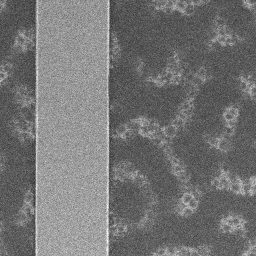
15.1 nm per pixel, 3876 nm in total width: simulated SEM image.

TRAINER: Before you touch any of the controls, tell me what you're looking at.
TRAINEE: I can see one or a few lines or trenches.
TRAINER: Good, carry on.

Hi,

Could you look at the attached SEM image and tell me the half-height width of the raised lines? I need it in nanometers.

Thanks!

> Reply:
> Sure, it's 1080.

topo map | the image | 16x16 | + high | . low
..+++++.........
..+++++.........
..+++++.........
..+++++.........
..+++++.........
..+++++.........
..+++++.........
..+++++.........
..+++++.........
..+++++.........
..+++++.........
..+++++.........
..+++++.........
..+++++.........
..+++++.........
..+++++.........